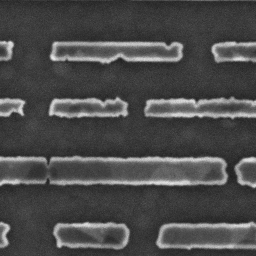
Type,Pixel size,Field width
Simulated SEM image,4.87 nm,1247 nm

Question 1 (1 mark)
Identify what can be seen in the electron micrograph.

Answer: one or a few lines or trenches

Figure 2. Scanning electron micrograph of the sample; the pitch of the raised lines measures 61.5 pixels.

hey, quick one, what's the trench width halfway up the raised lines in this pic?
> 207 nm